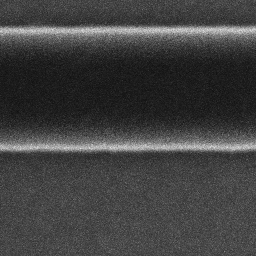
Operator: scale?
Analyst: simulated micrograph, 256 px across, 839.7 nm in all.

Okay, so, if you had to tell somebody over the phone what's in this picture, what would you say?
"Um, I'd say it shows one or a few lines or trenches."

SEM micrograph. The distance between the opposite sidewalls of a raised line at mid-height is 0.39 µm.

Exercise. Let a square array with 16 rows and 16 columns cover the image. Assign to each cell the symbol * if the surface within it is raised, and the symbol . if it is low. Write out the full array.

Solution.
................
................
****************
****************
****************
****************
****************
****************
****************
................
................
................
................
................
................
................